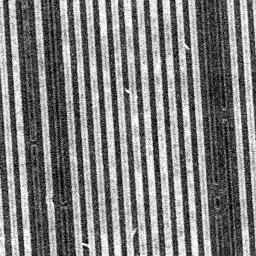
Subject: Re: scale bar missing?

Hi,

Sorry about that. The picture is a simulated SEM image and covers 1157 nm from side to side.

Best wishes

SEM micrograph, parallel lines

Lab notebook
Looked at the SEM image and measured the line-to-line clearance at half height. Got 33.3 nm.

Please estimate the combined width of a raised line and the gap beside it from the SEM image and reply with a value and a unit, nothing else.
57.9 nm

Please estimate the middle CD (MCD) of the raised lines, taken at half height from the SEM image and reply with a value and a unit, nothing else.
24.8 nanometers